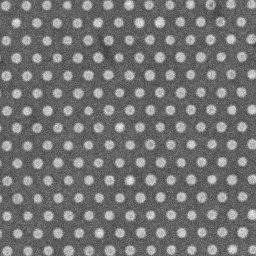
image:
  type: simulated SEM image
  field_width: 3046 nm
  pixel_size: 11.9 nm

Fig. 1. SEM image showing a regular array of raised bodies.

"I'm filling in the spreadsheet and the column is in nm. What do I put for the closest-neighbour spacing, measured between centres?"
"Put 236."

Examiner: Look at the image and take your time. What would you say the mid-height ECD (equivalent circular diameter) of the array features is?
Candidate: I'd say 108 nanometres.